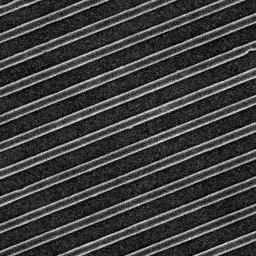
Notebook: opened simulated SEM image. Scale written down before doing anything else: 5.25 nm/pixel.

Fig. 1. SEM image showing parallel lines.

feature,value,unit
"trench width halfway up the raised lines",86.5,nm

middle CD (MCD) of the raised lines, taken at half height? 45.7 nm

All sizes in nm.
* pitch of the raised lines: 133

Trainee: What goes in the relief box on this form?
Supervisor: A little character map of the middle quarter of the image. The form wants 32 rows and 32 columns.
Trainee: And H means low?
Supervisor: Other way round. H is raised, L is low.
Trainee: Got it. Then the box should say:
HHHHLLLLLLLLLLLHHHHHHLLLLLLLLLLL
HLLLLLLLLLLLHHHHHHLLLLLLLLLLLHHH
LLLLLLLLLLHHHHHHLLLLLLLLLLLHHHHH
LLLLLLLHHHHHHLLLLLLLLLLLHHHHHHLL
LLLLLHHHHHHLLLLLLLLLLLHHHHHHLLLL
LLHHHHHHLLLLLLLLLLLLHHHHHLLLLLLL
HHHHHHLLLLLLLLLLLHHHHHHLLLLLLLLL
HHHLLLLLLLLLLLLHHHHHLLLLLLLLLLLL
HLLLLLLLLLLLHHHHHHLLLLLLLLLLLHHH
LLLLLLLLLHHHHHHLLLLLLLLLLLLHHHHH
LLLLLLLHHHHHLLLLLLLLLLLLHHHHHHLL
LLLLHHHHHHLLLLLLLLLLLLHHHHHHLLLL
LLHHHHHLLLLLLLLLLLLHHHHHHLLLLLLL
HHHHHLLLLLLLLLLLLHHHHHHLLLLLLLLL
HHLLLLLLLLLLLLHHHHHHLLLLLLLLLLLH
LLLLLLLLLLLLHHHHHHLLLLLLLLLLLHHH
LLLLLLLLLHHHHHLLLLLLLLLLLLHHHHHH
LLLLLLLHHHHHLLLLLLLLLLLLHHHHHHLL
LLLLHHHHHLLLLLLLLLLLLHHHHHHLLLLL
LLHHHHHLLLLLLLLLLLLHHHHHLLLLLLLL
HHHHLLLLLLLLLLLLHHHHHHLLLLLLLLLL
HHLLLLLLLLLLLLHHHHHLLLLLLLLLLLLH
LLLLLLLLLLLHHHHHHLLLLLLLLLLLHHHH
LLLLLLLLLHHHHHLLLLLLLLLLLLHHHHHL
LLLLLLHHHHHHLLLLLLLLLLLHHHHHHLLL
LLLLHHHHHLLLLLLLLLLLLHHHHHLLLLLL
LHHHHHHLLLLLLLLLLLHHHHHHLLLLLLLL
HHHHLLLLLLLLLLLLHHHHHLLLLLLLLLLL
HHLLLLLLLLLLLHHHHHHLLLLLLLLLLLHH
LLLLLLLLLLLHHHHHLLLLLLLLLLLLHHHH
LLLLLLLLHHHHHHLLLLLLLLLLLHHHHHHL
LLLLLLHHHHHLLLLLLLLLLLLHHHHHLLLL